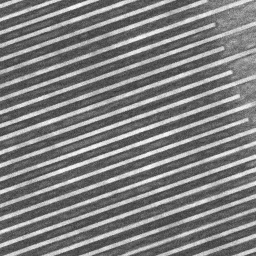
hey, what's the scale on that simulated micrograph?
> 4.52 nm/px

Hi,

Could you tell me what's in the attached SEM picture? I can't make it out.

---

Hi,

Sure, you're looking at parallel lines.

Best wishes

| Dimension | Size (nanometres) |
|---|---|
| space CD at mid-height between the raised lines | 42.2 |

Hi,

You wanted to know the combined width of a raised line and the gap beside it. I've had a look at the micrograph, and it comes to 56.7 nanometers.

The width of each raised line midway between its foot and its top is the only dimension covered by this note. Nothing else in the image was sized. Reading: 17 nm